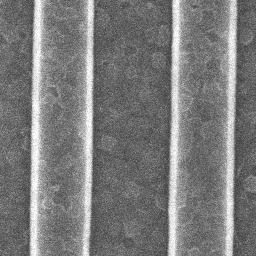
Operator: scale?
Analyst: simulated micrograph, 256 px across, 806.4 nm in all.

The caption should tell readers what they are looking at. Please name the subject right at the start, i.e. one or a few lines or trenches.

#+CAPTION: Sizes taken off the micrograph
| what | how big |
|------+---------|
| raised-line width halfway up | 176 nanometers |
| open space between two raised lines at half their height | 268 nanometers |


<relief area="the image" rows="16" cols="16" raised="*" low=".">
..****.....****.
..****.....****.
..****.....****.
..****.....****.
..****.....****.
..****.....***..
..****.....***..
..****.....***..
..****.....***..
..****.....***..
..****.....***..
..****.....***..
..****.....***..
..***......***..
..***......***..
..***......***..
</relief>